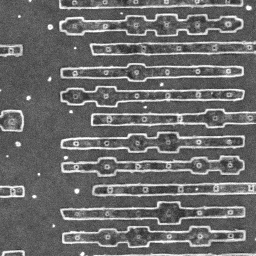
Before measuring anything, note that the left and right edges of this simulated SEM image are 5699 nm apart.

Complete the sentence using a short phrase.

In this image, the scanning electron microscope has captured wiring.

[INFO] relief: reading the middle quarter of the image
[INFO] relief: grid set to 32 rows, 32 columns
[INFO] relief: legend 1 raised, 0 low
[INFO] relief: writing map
00000000000000001111000000000000
11111111111111111111111111111111
11111111111111111111111111111111
00000011111111001111100000000000
00000000000000000000000000000000
00000000000000000000000000000000
01111000111110000000000000000000
11111111111111111111111111111111
11111111111111111111111111111111
01111000111111000000000000000000
00000000000000000000000000000000
00000000000000000000000000000000
00000000000000000000000000000000
00000001111111111111111111111111
00000001111111111111111111111111
00000000000000000000000000000000
00000000000000000000000000000000
00000000000000000000000011110000
00000000000000001111100111111011
11111111111111111111111111111111
11111111111111111111111111111111
00000000000000001111000011111000
00000000000000000000000000000000
00000000001100000000000000000000
00000000111110000001111110011111
11111111111111111111111111111111
11111111111111111111101110000001
00000000011110000000000000000000
00000000000000000000000000000000
00000000000000000000000000000000
00000000111111111111111111111111
00000000111011111111111111111111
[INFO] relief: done